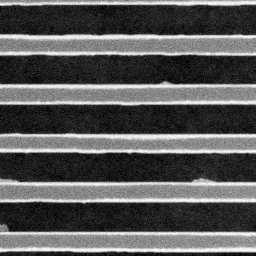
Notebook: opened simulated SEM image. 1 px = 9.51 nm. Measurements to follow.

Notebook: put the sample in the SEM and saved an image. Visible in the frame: lines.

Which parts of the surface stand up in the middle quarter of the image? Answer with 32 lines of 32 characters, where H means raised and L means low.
LLLLLLLLLLLLLLLLLLLLLLLLLLLLLLLL
LLLLLLLLLLLLLLLLLLLLLLLLLLLLLLLL
LLLLLLLLLLLLLLLLLLLLLLLLLLLLLLLL
LLLLLLLLLLLLLLLLLLLLLLLLLLLLLLLL
LLLLLLLLLLLLLLLLLLLLLLLLLLLLLLLL
HHHHHHHHHHHHHHHHHHHHHHHHHHHHHHHH
HHHHHHHHHHHHHHHHHHHHHHHHHHHHHHHH
HHHHHHHHHHHHHHHHHHHHHHHHHHHHHHHH
HHHHHHHHHHHHHHHHHHHHHHHHHHHHHHHH
HHHHHHHHHHHHHHHHHHHHHHHHHHHHHHHH
LLLLLLLLLLLLLLLLLLLLLLLLLLLLLLLL
LLLLLLLLLLLLLLLLLLLLLLLLLLLLLLLL
LLLLLLLLLLLLLLLLLLLLLLLLLLLLLLLL
LLLLLLLLLLLLLLLLLLLLLLLLLLLLLLLL
LLLLLLLLLLLLLLLLLLLLLLLLLLLLLLLL
LLLLLLLLLLLLLLLLLLLLLLLLLLLLLLLL
LLLLLLLLLLLLLLLLLLLLLLLLLLLLLLLL
LLLLLLLLLLLLLLLLLLLLLLLLLLLLLLLL
HHHHHHHHHHHHHHHHHHHHHHHHHHHHHHHH
HHHHHHHHHHHHHHHHHHHHHHHHHHHHHHHH
HHHHHHHHHHHHHHHHHHHHHHHHHHHHHHHH
HHHHHHHHHHHHHHHHHHHHHHHHHHHHHHHH
LLLLLLLLLLLLLLLLLLLLLLLLLLLLLLLL
LLLLLLLLLLLLLLLLLLLLLLLLLLLLLLLL
LLLLLLLLLLLLLLLLLLLLLLLLLLLLLLLL
LLLLLLLLLLLLLLLLLLLLLLLLLLLLLLLL
LLLLLLLLLLLLLLLLLLLLLLLLLLLLLLLL
LLLLLLLLLLLLLLLLLLLLLLLLLLLLLLLL
LLLLLLLLLLLLLLLLLLLLLLLLLLLLLLLL
LLLLLLLLLLLLLLLLLLLLLLLLLLLLLLLL
HHHHHHHHHHHHHHHHHHHHHHHHHHHHHHHH
HHHHHHHHHHHHHHHHHHHHHHHHHHHHHHHH